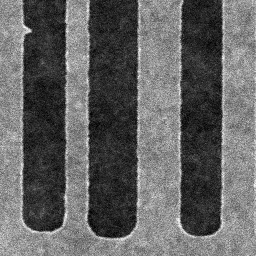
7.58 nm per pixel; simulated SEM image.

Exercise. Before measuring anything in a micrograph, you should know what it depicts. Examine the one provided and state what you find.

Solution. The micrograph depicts one or a few lines or trenches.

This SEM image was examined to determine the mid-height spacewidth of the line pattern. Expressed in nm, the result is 330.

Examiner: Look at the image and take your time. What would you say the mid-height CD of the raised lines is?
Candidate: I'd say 260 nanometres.